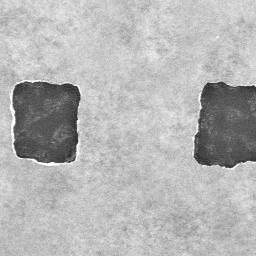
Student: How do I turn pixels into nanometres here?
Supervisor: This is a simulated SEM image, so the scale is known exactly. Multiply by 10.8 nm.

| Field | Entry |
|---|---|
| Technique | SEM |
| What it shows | holes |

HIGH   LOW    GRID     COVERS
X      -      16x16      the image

XXXXXXXXXXXXXXXX
XXXXXXXXXXXXXXXX
XXXXXXXXXXXXXXXX
XXXXXXXXXXXXXXXX
XXXXXXXXXXXXXXXX
X----XXXXXXXX---
X----XXXXXXX----
X----XXXXXXX----
X----XXXXXXX----
X----XXXXXXX----
XXXXXXXXXXXXXXXX
XXXXXXXXXXXXXXXX
XXXXXXXXXXXXXXXX
XXXXXXXXXXXXXXXX
XXXXXXXXXXXXXXXX
XXXXXXXXXXXXXXXX